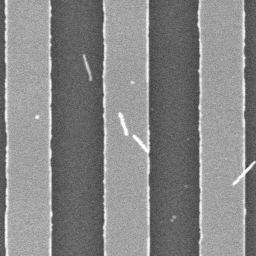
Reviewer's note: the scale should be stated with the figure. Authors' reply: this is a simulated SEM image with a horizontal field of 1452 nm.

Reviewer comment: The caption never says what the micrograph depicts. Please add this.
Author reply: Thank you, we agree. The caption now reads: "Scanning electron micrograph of lines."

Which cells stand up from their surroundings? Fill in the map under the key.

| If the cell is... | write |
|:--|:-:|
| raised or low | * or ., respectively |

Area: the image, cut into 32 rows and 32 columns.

.*****.......*****.......*****..
.*****.......*****.......******.
.*****.......*****.......******.
.*****.......*****.......******.
.*****.......*****.......******.
.*****.......*****.......*****..
.*****.......*****.......*****..
.*****.......*****.......******.
.*****.......*****.......******.
.*****.......*****.......*****..
.*****.......*****.......******.
.*****.......*****.......******.
.*****.......*****.......******.
.*****.......*****.......******.
.*****.......*****.......******.
.*****.......*****.......******.
.*****.......******......******.
.*****.......******......******.
.*****.......******......******.
.*****.......*****.......******.
.*****.......******......******.
.*****.......******......******.
.*****.......*****.......******.
.*****.......******......******.
.*****.......******......******.
.*****.......******......******.
.*****.......******......******.
.*****.......******......******.
.*****.......******......******.
.*****.......******......******.
.*****.......******......******.
.*****.......******......******.